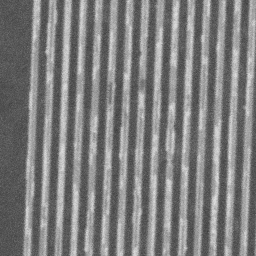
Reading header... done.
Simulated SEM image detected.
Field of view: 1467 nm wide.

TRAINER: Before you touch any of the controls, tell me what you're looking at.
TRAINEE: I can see parallel lines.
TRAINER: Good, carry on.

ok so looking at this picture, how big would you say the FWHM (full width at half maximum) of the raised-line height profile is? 36.5 nm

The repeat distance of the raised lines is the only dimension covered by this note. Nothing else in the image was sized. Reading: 15.4 pixels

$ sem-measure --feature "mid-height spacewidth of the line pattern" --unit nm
52.3